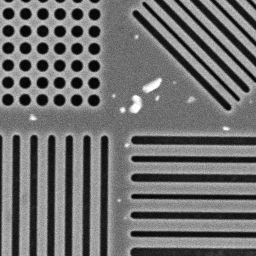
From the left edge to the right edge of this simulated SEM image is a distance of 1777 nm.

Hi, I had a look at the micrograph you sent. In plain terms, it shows groups of lines, slits or small figures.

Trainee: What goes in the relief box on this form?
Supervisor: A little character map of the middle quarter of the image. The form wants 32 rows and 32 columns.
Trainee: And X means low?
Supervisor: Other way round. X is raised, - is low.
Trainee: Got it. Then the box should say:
-X---X---XXXXXXXXXXXXXXXXXXXXX--
XX--XX---XXXXXXXXXXXXXXXXXXXXXX-
XXXXXXXXXXXXXXXXXXXXXXXXXXXXXXX-
XX--XXX-XXXXXXXXXXXXXXXXXXXXXXXX
XX---X---XXXXXXXXXXXXXXXXXXXXXXX
XX---X---XXXXXXXXXXXXXXXXXXXXXXX
XXXXXXX-XXXXXXXXXXXXXXXXXXXXXXXX
XXXXXXXXXXXXXXXXXXXXXXXXXXXXXXXX
XX---X---XXXXXXXXXXXXXXXXXXXXXXX
XX---X---XXXXXXXXXXXXXXXXXXXXXXX
XXX-XXX-XXXXXXXXXXXXXXXXXXXXXXXX
XXXXXXXXXXXXXXXXXXXXXXXXXXXXXXXX
XXXXXXXXXXXXXXXXXXXXXXXXXXXXXXXX
XXXXXXXXXXXXXXXXXXXXXXXXXXXXXXXX
XXXXXXXXXXXXXXXXXXXXXXXXXXXXXXXX
XXXXXXXXXXXXXXXXXXXXXXXXXXXXXXXX
XXXXXXXXXXXXXXXXXXXXXXXXXXXXXXXX
XXXXXXXXXXXXXXXXXXXXXXXXXXXXXXXX
--XXX--XX--XXXXXX---------------
--XXX--XX--XXXXXX---------------
--XXX--XX--XXXXXXXXXXXXXXXXXXXXX
--XXX--XX--XXXXXXXXXXXXXXXXXXXXX
--XXX--XX--XXXXXXXXXXXXXXXXXXXXX
--XXX--XX--XXXXXX---------------
--XXX--XX--XXXXXX---------------
--XXX--XX--XXXXXXXXXXXXXXXXXXXXX
--XXX--XX--XXXXXXXXXXXXXXXXXXXXX
--XXX--XX--XXXXXX---------------
--XXX--XX--XXXXXX---------------
--XXX--XX--XXXXXXX--------------
--XXX--XX--XXXXXXXXXXXXXXXXXXXXX
--XXX--XX--XXXXXXXXXXXXXXXXXXXXX